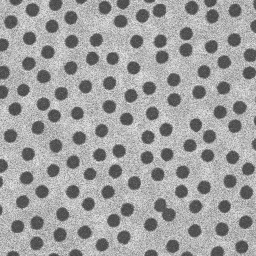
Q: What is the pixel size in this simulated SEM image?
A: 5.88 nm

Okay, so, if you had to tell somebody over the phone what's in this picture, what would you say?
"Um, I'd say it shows a regular array of holes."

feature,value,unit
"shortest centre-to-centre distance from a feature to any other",0.121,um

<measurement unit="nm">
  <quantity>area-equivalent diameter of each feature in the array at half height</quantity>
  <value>78.7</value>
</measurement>